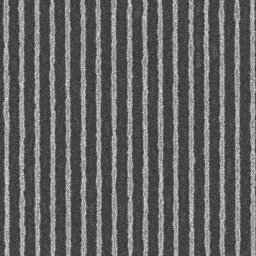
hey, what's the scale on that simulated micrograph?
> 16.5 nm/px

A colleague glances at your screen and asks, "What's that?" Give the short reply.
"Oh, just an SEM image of parallel lines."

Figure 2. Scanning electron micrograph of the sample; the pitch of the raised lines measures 254 nm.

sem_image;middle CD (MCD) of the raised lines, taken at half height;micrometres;0.0618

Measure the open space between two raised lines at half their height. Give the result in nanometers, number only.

185